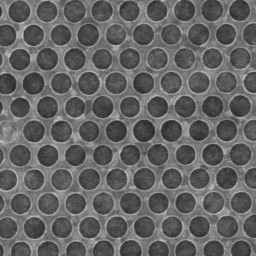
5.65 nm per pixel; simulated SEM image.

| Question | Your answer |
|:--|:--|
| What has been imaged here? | a regular array of holes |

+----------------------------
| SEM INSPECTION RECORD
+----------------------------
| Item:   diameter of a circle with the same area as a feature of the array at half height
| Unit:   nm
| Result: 123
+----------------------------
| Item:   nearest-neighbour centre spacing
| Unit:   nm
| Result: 155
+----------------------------